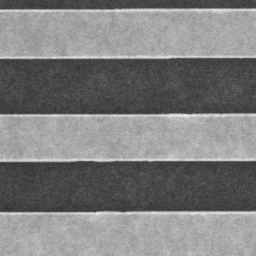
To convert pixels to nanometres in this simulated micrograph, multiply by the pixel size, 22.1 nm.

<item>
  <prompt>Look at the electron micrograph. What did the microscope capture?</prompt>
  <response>lines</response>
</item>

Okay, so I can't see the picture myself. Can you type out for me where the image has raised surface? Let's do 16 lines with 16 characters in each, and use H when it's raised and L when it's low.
LLLLLLLLLLLLLLLL
HHHHHHHHHHHHHHHH
HHHHHHHHHHHHHHHH
HHHHHHHHHHHHHHHH
LLLLLLLLLLLLLLLL
LLLLLLLLLLLLLLLL
LLLLLLLLLLLLLLLL
HHHHHHHHHHHHHHHH
HHHHHHHHHHHHHHHH
HHHHHHHHHHHHHHHH
LLLLLLLLLLLLLLLL
LLLLLLLLLLLLLLLL
LLLLLLLLLLLLLLLL
HHHHHHHHHHHHHHHH
HHHHHHHHHHHHHHHH
HHHHHHHHHHHHHHHH